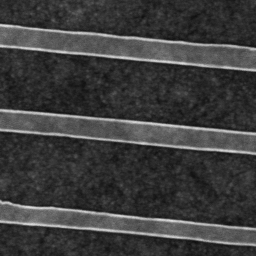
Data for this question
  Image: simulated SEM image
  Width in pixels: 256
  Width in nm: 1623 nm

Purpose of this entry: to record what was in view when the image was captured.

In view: one or a few lines or trenches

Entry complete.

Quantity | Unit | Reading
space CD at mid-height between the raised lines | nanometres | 430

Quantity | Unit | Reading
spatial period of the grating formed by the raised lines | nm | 558